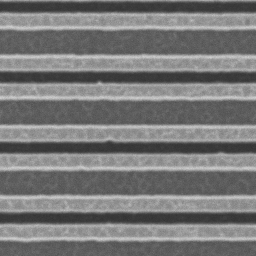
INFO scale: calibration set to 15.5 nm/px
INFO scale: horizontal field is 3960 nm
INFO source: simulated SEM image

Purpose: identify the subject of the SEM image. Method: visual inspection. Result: parallel lines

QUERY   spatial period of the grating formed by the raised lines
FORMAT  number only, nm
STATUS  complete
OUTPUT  545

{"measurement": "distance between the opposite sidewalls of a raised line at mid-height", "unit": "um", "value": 0.238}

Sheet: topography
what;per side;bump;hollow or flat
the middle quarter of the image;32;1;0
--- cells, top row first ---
11111111111111111111111111111111
11111111111111111111111111111111
00000000000000000000000000000000
00000000000000000000000000000000
00000000000000000000000000000000
11111111111111111111111111111111
11111111111111111111111111111111
11111111111111111111111111111111
11111111110111111111111111111111
00000000000000000000000000000000
00000000000000000000000000000000
00000000000000000000000000000000
00000000000000000000000000000000
00000000000000000000000000000000
00000000000000000000000000000000
11110011000000000101100000000000
11111111111111111111111111111111
11111111111111111111111111111111
11111111111111111111111111111111
00000000000000000000000000000000
00000000000000000000000000000000
00000000000000000000000000000000
11110011111111111111101110111100
11111111111111111111111111111111
11111111111111111111111111111111
11111111111111111111111111111111
00000000000000000000000000000000
00000000000000000000000000000000
00000000000000000000000000000000
00000000000000000000000000000000
00000000000000000000000000000000
00000000000000000000000000000000